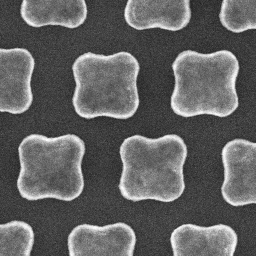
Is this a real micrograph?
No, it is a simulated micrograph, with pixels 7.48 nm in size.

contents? raised bodies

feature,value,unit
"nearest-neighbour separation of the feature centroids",723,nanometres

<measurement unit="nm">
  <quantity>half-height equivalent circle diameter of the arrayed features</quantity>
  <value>518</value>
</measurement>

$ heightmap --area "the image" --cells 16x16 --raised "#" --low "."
.####...####..##
..###...####..##
................
##...#.#...####.
##...####..####.
##...####..####.
##...####..####.
................
................
.####...####..##
.####...###...##
.####...###...##
..........#...##
................
##...###...###..
##..####...####.